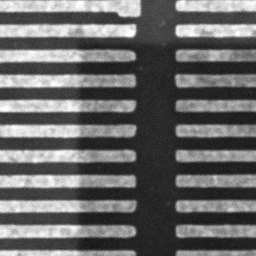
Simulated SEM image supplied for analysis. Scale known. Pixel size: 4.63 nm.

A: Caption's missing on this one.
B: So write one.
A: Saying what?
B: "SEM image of wiring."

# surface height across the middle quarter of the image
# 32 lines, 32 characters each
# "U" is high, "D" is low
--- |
DDDDDDDDDDDDDDDDDDDDDDDDDDDDDDDD
DDDDDDDDDDDDDDDDDDDDDDDDDDDDDDDD
DDDDDDDDDDDDDDDDDDDDDDDDDDDDDDDD
UUUUUUUUUUUUUUUUUUDDDDDDDDDDUUUU
UUUUUUUUUUUUUUUUUUDDDDDDDDDDUUUU
UUUUUUUUUUUUUUUUUUDDDDDDDDDDUUUU
DDDDDDDDDDDDDDDDDDDDDDDDDDDDDDDD
DDDDDDDDDDDDDDDDDDDDDDDDDDDDDDDD
DDDDDDDDDDDDDDDDDDDDDDDDDDDDDDDD
UUUUUUUUUUUUUUUUUUDDDDDDDDDDUUUU
UUUUUUUUUUUUUUUUUUDDDDDDDDDDUUUU
UUUUUUUUUUUUUUUUUDDDDDDDDDDDUUUU
DDDDDDDDDDDDDDDDDDDDDDDDDDDDDDDD
DDDDDDDDDDDDDDDDDDDDDDDDDDDDDDDD
DDDDDDDDDDDDDDDDDDDDDDDDDDDDDDDD
DDDDDDDDDDDDDDUUUDDDDDDDDDDDDUUU
UUUUUUUUUUUUUUUUUUDDDDDDDDDDUUUU
UUUUUUUUUUUUUUUUUUDDDDDDDDDDUUUU
DDDDDDDDDDDDDDDDDDDDDDDDDDDDDDDD
DDDDDDDDDDDDDDDDDDDDDDDDDDDDDDDD
DDDDDDDDDDDDDDDDDDDDDDDDDDDDDDDD
DDDDDDDDDDDDDDDDDDDDDDDDDDDDDDDD
UUUUUUUUUUUUUUUUUUDDDDDDDDDDUUUU
UUUUUUUUUUUUUUUUUUDDDDDDDDDDUUUU
DDDDUUUDDDDDDDDDDDDDDDDDDDDDDDDD
DDDDDDDDDDDDDDDDDDDDDDDDDDDDDDDD
DDDDDDDDDDDDDDDDDDDDDDDDDDDDDDDD
DDDDDDDDDDDDDDDDDDDDDDDDDDDDDDDD
UUUUUUUUUUUUUUUUUUDDDDDDDDDDUUUU
UUUUUUUUUUUUUUUUUUDDDDDDDDDDUUUU
UUUUUUUUUUUUUUUUUUDDDDDDDDDDDUUU
DDDDDDDDDDDDDDDDDDDDDDDDDDDDDDDD